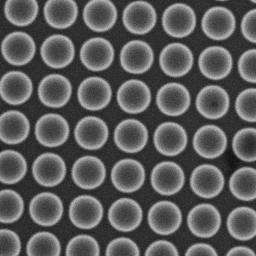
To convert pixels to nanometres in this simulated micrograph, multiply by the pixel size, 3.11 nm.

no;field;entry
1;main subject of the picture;an array of small figures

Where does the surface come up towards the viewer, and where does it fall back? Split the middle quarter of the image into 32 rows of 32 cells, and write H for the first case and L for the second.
HLLLLHHHHHHLLLLHHHHHHHLLHHHHHHHH
LLLLLLLHHHLLLLLHHHHHHLLLLHHHHHHL
LLLLLLLLLLLLLLLLLLLLLLLLLLHHHHLL
LLLLLLHHHLLLLLLLLLLLLLLLLLLLLLLL
HLLLLHHHHHHLLLLHHHHHLLLLLLLLLLLL
HHLLHHHHHHHLLLHHHHHHHLLLLHHHHHLL
HHLLHHHHHHHHLLHHHHHHHLLLHHHHHHHL
HHLHHHHHHHHHLHHHHHHHHHLHHHHHHHHL
HLLHHHHHHHHHLHHHHHHHHHLHHHHHHHHL
HLLLHHHHHHHLLHHHHHHHHHLHHHHHHHHL
LLLLLHHHHHLLLLHHHHHHHLLHHHHHHHHL
LLLLLLHHLLLLLLLHHHHHLLLLHHHHHHHL
LLLLLLLLLLLLLLLLLLLLLLLLLHHHHLLL
LLLLLHHHLLLLLLLLLLLLLLLLLLLLLLLL
HLLLHHHHHHLLLLHHHHHLLLLLLLLLLLLL
HLLHHHHHHHHLLHHHHHHHLLLLHHHHHLLL
HLLHHHHHHHHLLHHHHHHHHLLHHHHHHHLL
HLLHHHHHHHHLLHHHHHHHHLLHHHHHHHHL
HLLHHHHHHHHLLHHHHHHHHLHHHHHHHHHL
LLLHHHHHHHLLLHHHHHHHHLHHHHHHHHHL
LLLLHHHHHLLLLHHHHHHHLLLHHHHHHHLL
LLLLLLLLLLLLLLHHHHHLLLLHHHHHHHLL
LLLLLLLLLLLLLLLLLLLLLLLLHHHHHLLL
LLLLHHHHLLLLLLLLLLLLLLLLLLLLLLLL
LLLHHHHHHLLLLLHHHHHLLLLLLHHLLLLL
LLHHHHHHHHLLLHHHHHHHLLLHHHHHHLLL
LLHHHHHHHHLLHHHHHHHHLLHHHHHHHHLL
LLHHHHHHHHLLHHHHHHHHLLHHHHHHHHLL
LLHHHHHHHHLLHHHHHHHHLLHHHHHHHHLL
LLLHHHHHHHLLHHHHHHHHLLHHHHHHHHLL
LLLLHHHHHLLLLHHHHHHLLLHHHHHHHHLL
LLLLLLLLLLLLLLHHHHLLLLLHHHHHHLLL